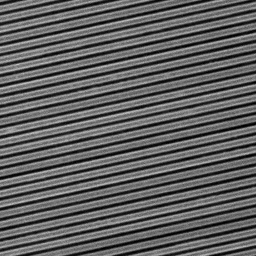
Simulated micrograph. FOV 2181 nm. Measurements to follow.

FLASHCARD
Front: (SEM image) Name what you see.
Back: parallel lines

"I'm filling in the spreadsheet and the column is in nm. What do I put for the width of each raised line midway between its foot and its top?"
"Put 45.8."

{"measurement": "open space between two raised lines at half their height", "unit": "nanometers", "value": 38.5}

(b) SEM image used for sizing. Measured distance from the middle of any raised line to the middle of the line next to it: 0.0856 um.